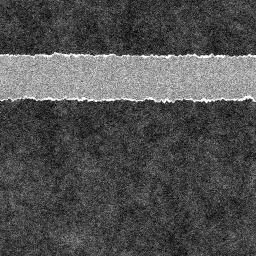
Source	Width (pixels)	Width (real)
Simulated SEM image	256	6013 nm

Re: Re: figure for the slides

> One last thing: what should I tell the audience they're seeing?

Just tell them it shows one or a few lines or trenches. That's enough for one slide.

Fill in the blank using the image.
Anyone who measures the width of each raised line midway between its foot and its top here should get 1040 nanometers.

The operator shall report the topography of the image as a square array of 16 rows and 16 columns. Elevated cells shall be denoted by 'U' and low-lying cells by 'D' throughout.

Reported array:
DDDDDDDDDDDDDDDD
DDDDDDDDDDDDDDDD
DDDDDDDDDDDDDDDD
UUUUUUUUDDUUUUDU
UUUUUUUUUUUUUUUU
UUUUUUUUUUUUUUUU
DDDDDDDDDDDDDDDD
DDDDDDDDDDDDDDDD
DDDDDDDDDDDDDDDD
DDDDDDDDDDDDDDDD
DDDDDDDDDDDDDDDD
DDDDDDDDDDDDDDDD
DDDDDDDDDDDDDDDD
DDDDDDDDDDDDDDDD
DDDDDDDDDDDDDDDD
DDDDDDDDDDDDDDDD